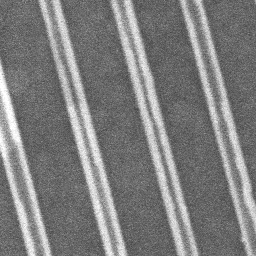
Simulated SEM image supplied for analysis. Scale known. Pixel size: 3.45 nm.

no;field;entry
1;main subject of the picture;one or a few lines or trenches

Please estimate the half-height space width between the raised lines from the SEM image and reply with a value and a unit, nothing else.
53.5 pixels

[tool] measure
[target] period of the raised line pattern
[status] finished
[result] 240 nanometres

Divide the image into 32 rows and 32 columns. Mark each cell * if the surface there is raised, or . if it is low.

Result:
.....**.......**.......**.......
......*........**......**.......
......**.......**......***......
......**.......**.......**......
......**.......**.......**......
.......*........**......**......
.......**.......**.......**.....
.......**.......**.......**.....
.......**.......**.......**.....
........**.......**......**.....
........**.......**.......**....
*.......**.......**.......**....
*.......**.......**.......**....
*........**.......**......**....
*........**.......**.......**...
**.......**.......**.......**...
**........*.......**.......**...
**........**.......**......**...
**........**.......**.......**..
.**.......**.......**.......**..
.**........*........**......**..
.**........**.......**.......**.
.***.......**.......**.......**.
..**.......**.......**.......**.
..**........**.......**......**.
..**........**.......**.......**
..***.......**.......**.......**
...**.......**.......**.......**
...**........**.......**......**
...**........**.......**.......*
....**.......**.......**.......*
....**.......**.......**.......*